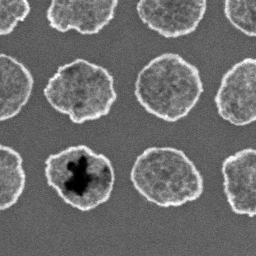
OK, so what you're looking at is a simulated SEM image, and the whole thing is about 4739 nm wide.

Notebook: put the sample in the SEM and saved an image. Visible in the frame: raised bodies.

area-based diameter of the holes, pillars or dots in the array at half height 1130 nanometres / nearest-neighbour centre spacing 1590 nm